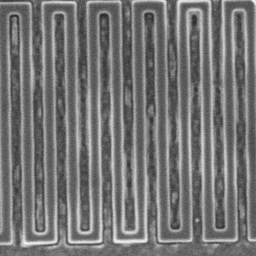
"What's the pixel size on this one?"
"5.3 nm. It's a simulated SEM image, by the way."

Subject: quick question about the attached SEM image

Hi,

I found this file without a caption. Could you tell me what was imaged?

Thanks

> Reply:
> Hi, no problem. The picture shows groups of lines, slits or small figures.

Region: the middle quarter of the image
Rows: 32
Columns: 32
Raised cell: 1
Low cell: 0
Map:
11100011100011000111000111000110
11100011100011000111000111000110
11100011100011100111000111001110
11100011100011100111000111001110
11100011100011100111000111001110
01100011100011100111000111000110
01100011100011100111000111000110
01100011100011100111000111000110
01100011100011100111000111000110
01100011100011100011000111000110
01100011100011100011000111000110
01100011100011100011000111000110
01100011100011100011000111000110
01100011100011100011000111000110
01100011100011100011000111000110
01110011100011100011000111000110
01100011100011100011000111000110
01100011100011100011000111000110
01110011100011100011000111000110
01110011100011100011000111000110
01110011100011100011000111000111
01110011100011100011000111000111
01110011100011100011000111000111
01110011100011100011000111000111
01110011100011100011000111000111
01110011100011100011000111000111
01110011100011100011000111000111
01110011100011100011000111000111
01110011100011100011000111000111
01110011100011100011000111000111
01110011100011100011000111000111
01110011100011100011000111000111